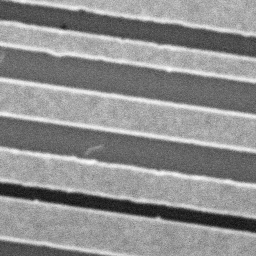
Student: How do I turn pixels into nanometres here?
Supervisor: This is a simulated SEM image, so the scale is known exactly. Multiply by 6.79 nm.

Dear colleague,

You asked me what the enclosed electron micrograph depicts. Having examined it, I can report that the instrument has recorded one or a few lines or trenches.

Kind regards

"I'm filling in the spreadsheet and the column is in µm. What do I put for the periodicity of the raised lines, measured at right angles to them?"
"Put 0.428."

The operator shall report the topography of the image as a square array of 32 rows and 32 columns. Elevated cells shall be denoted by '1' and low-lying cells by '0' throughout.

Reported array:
00000111111111111111111111111111
00000000000011111111111111111111
00000000000000000001111111111111
11111000000000000000000000111111
11111111111100000000000000000000
11111111111111111110000000000000
00000011111111111111111111000000
00000000000001111111111111111111
00000000000000000000111111111111
00000000000000000000000000011111
11111000000000000000000000000000
11111111111000000000000000000000
11111111111111111100000000000000
11111111111111111111111110000000
00111111111111111111111111111111
00000000111111111111111111111111
00000000000000011111111111111111
00000000000000000000001111111111
00000000000000000000000000000111
11111100000000000000000000000000
11111111111110000000000000000000
11111111111111111110000000000000
11111111111111111111111111110000
00000011111111111111111111111111
00000000000001111111111111111111
11111100000000000000011111111111
11111111111110000000000000011111
11111111111111111111000000000000
11111111111111111111111111100000
11111111111111111111111111111111
00000011111111111111111111111111
00000000000011111111111111111111